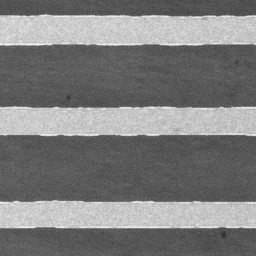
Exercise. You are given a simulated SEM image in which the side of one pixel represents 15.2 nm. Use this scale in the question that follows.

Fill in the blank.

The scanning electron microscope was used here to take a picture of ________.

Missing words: lines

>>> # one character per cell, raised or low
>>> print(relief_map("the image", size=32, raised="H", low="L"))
LLLLLLLLLLLLLLLLLLLLLLLLLLLLLLLL
LLLLLLLLLLLLLLLLLLLLLLLLLLLLLLLL
HHHHHHHHHHHHHHHHHHHHHHHHHHHHHHHH
HHHHHHHHHHHHHHHHHHHHHHHHHHHHHHHH
HHHHHHHHHHHHHHHHHHHHHHHHHHHHHHHH
HHHHHHLLLLLLHHHHHLLLHHHHHLLLLLLL
LLLLLLLLLLLLLLLLLLLLLLLLLLLLLLLL
LLLLLLLLLLLLLLLLLLLLLLLLLLLLLLLL
LLLLLLLLLLLLLLLLLLLLLLLLLLLLLLLL
LLLLLLLLLLLLLLLLLLLLLLLLLLLLLLLL
LLLLLLLLLLLLLLLLLLLLLLLLLLLLLLLL
LLLLLLLLLLLLLLLLLLLLLLLLLLLLLLLL
LLLLLLLLLLLLLLLLLLLLLLLLLLLLLLLL
LHHHLLLLLLLLLLLHHLHHHHLLLLLLLLHH
HHHHHHHHHHHHHHHHHHHHHHHHHHHHHHHH
HHHHHHHHHHHHHHHHHHHHHHHHHHHHHHHH
HHHHHHHHHHHHHHHHHHHHHHHHHHHHHHHH
LLLLLLLLLLLLLLLLLLLLLLLLLLLLLLLL
LLLLLLLLLLLLLLLLLLLLLLLLLLLLLLLL
LLLLLLLLLLLLLLLLLLLLLLLLLLLLLLLL
LLLLLLLLLLLLLLLLLLLLLLLLLLLLLLLL
LLLLLLLLLLLLLLLLLLLLLLLLLLLLLLLL
LLLLLLLLLLLLLLLLLLLLLLLLLLLLLLLL
LLLLLLLLLLLLLLLLLLLLLLLLLLLLLLLL
LLLLLLLLLLLLLLLLLLLLLLLLLLLLLLLL
HHHHHHHHHHHHHHHHHHHHHHHHHHHHHHHH
HHHHHHHHHHHHHHHHHHHHHHHHHHHHHHHH
HHHHHHHHHHHHHHHHHHHHHHHHHHHHHHHH
LLLLLLLLLLLLLLLLLLLLLLLLLLLLLLLL
LLLLLLLLLLLLLLLLLLLLLLLLLLLLLLLL
LLLLLLLLLLLLLLLLLLLLLLLLLLLLLLLL
LLLLLLLLLLLLLLLLLLLLLLLLLLLLLLLL